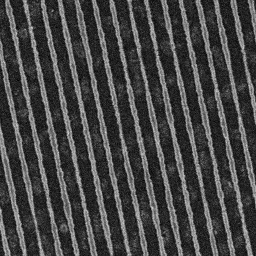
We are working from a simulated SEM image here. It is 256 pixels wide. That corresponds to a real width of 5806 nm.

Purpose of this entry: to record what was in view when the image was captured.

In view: parallel lines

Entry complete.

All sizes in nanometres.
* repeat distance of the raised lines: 386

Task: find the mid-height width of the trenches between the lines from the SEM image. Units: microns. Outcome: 0.317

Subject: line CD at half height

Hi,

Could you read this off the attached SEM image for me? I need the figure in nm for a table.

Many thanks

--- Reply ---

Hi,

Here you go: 77.8